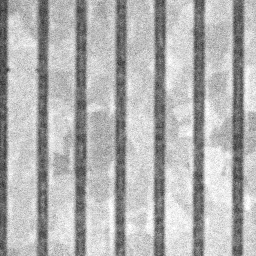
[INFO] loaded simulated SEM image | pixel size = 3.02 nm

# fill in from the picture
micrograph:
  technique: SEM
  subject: parallel lines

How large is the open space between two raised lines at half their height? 35.5 nanometers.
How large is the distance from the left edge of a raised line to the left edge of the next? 0.119 micrometres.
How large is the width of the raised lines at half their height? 82.8 nanometers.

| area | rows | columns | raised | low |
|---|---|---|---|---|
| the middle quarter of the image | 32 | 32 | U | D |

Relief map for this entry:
UUUDDDUUUUUUUDDDUUUUUUDDDDUUUUUU
UUUDDDUUUUUUUDDDUUUUUUDDDDUUUUUU
UUUDDDUUUUUUUDDDUUUUUUDDDDUUUUUU
UUUDDDUUUUUUUDDDUUUUUUDDDDUUUUUU
UUUDDDUUUUUUUDDDUUUUUUDDDDUUUUUU
UUUDDDUUUUUUUDDDUUUUUUDDDDUUUUUU
UUUDDDUUUUUUUDDDUUUUUUDDDDUUUUUU
UUUDDDUUUUUUUDDDUUUUUUDDDDUUUUUU
UUUDDDUUUUUUUDDDUUUUUUDDDDUUUUUU
UUUDDDUUUUUUUDDDUUUUUUDDDDUUUUUU
UUUDDDUUUUUUUDDDUUUUUUDDDDUUUUUU
UUUDDDUUUUUUUDDDUUUUUUDDDUUUUUUU
UUUDDDUUUUUUUDDDUUUUUUDDDUUUUUUU
UUUDDDUUUUUUUDDDUUUUUUDDDUUUUUUU
UUUDDDUUUUUUUDDDUUUUUUDDDUUUUUUU
UUUDDDUUUUUUUDDDUUUUUUDDDUUUUUUU
UUUDDDUUUUUUUDDDUUUUUUDDDUUUUUUU
UUUDDDUUUUUUUDDDUUUUUUDDDUUUUUUU
UUUDDDUUUUUUUDDDUUUUUUDDDUUUUUUU
UUUDDDUUUUUUUDDDUUUUUUDDDUUUUUUU
UUDDDDUUUUUUUDDDUUUUUUDDDUUUUUUU
UUDDDDUUUUUUUDDDUUUUUUDDDUUUUUUU
UUDDDDUUUUUUUDDDUUUUUUDDDUUUUUUU
UUDDDDUUUUUUUDDDUUUUUUDDDUUUUUUU
UUDDDDUUUUUUDDDDUUUUUUDDDUUUUUUU
UUDDDDUUUUUUDDDDUUUUUUDDDUUUUUUU
UUDDDDUUUUUUDDDDUUUUUUUDDUUUUUUU
UUDDDDUUUUUUDDDDUUUUUUDDDUUUUUUU
UUDDDDUUUUUUDDDDUUUUUUDDDUUUUUUU
UUDDDDUUUUUUDDDDUUUUUUDDDUUUUUUU
UUDDDDUUUUUUDDDDUUUUUUDDDUUUUUUU
UUDDDUUUUUUUDDDDUUUUUUDDDUUUUUUU